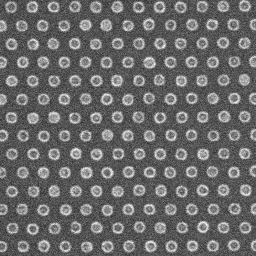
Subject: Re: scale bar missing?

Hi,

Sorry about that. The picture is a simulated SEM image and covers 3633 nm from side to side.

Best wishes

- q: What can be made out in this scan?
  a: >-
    a regular array of raised bodies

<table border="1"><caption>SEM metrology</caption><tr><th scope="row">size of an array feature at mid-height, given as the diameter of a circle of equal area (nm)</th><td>137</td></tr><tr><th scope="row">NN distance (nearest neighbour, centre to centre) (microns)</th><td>0.292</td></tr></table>